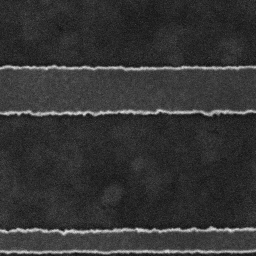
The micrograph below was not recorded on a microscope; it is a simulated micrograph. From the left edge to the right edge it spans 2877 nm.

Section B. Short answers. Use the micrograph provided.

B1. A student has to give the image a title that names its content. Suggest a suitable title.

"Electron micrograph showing one or a few lines or trenches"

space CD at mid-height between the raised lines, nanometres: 1320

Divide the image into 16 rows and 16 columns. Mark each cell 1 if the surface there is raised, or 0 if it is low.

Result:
0000000000000000
0000000000000000
0000000000000000
0000000000000000
1111111111111111
1111111111111111
1111111111111111
0000000000000000
0000000000000000
0000000000000000
0000000000000000
0000000000000000
0000000000000000
0000000000000000
1111111111111111
1111111111111111